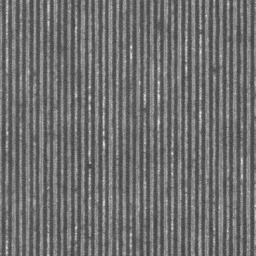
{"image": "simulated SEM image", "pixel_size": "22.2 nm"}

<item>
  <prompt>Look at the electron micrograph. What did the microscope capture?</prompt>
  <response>parallel lines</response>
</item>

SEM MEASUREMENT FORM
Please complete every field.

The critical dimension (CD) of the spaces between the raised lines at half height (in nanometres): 30.6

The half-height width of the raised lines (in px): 5.5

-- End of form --